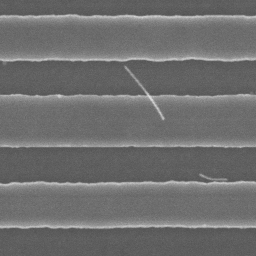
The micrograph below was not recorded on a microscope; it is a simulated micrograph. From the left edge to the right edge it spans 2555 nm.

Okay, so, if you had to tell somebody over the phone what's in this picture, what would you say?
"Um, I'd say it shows lines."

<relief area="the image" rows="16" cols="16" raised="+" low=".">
................
++++++++++++++++
++++++++++++++++
++++++++++++++++
................
................
++++++++++++++++
++++++++++++++++
++++++++++++++++
................
................
++++++++++++++++
++++++++++++++++
++++++++++++++++
................
................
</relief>